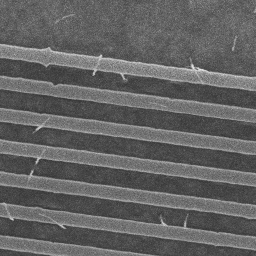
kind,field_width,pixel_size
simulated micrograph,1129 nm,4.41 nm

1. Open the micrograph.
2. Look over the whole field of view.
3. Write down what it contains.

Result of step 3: parallel lines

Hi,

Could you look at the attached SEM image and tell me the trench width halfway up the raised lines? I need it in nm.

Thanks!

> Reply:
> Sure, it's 83.6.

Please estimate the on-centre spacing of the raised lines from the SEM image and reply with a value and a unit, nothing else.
139 nm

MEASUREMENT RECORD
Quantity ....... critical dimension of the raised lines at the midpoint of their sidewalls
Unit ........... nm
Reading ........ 58.4